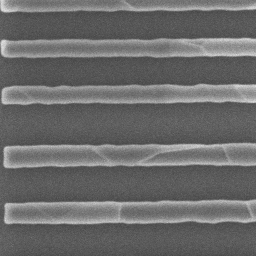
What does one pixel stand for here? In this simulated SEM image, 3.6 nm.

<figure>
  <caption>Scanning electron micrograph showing groups of lines, slits or small figures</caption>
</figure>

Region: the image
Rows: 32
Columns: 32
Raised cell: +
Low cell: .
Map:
++++++++++++++++++++++++++++++++
................................
................................
................................
................................
++++++++++++++++++++++++++++++++
++++++++++++++++++++++++++++++++
................................
................................
................................
................................
++++++++++++++++++++++++++++++++
++++++++++++++++++++++++++++++++
................................
................................
................................
................................
................................
.+++++++++++++++++++++++++++++++
++++++++++++++++++++++++++++++++
++++++++++++++++++++++++++++++++
................................
................................
................................
................................
.+++++++++++++++++++++++++++++++
.+++++++++++++++++++++++++++++++
.+++++++++++++++++++++++++++++++
................................
................................
................................
................................